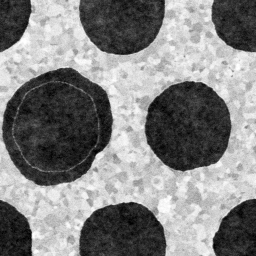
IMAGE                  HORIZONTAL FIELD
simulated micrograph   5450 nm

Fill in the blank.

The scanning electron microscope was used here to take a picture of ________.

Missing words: holes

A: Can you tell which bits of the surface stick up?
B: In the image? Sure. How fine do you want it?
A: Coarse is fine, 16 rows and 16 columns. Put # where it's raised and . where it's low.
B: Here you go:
..###.....###...
..###.....###...
.#####....####..
################
###..###########
#.....####...###
.......##.....##
.......##.....##
.......##.....##
......####....##
#.....#####.####
##..############
###############.
..####....####..
..###.....###...
..###.....###...